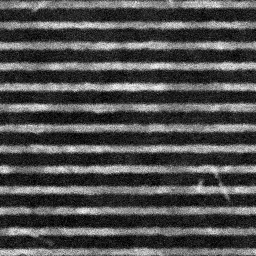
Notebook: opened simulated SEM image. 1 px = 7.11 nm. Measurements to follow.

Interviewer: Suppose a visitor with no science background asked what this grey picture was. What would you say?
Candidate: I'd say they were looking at parallel lines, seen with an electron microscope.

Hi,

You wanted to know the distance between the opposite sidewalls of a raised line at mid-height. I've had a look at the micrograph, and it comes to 38.2 nm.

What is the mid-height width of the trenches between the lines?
108 nanometres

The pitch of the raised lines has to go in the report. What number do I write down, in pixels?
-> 20.6